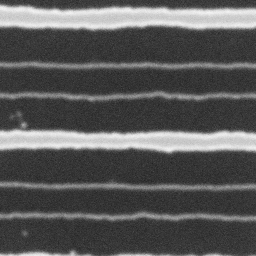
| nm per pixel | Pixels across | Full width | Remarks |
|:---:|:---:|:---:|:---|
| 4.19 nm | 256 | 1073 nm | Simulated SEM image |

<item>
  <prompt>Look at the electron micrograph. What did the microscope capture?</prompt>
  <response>lines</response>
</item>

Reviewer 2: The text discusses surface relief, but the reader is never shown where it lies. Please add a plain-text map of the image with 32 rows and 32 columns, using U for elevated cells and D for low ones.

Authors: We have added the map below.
DDDDDDDDDDDDDDDDDDDDDDDDDDDDDDDD
UUUUUUUUUUUUUUUUUUUUUUUUUUUUUUUU
UUUUUUUUUUUUUUUUUUUUUUUUUUUUUUUU
DDDDDDDDDDDUDDDDDDDDDDDDDDDDDDDD
DDDDDDDDDDDDDDDDDDDDDDDDDDDDDDDD
DDDDDDDDDDDDDDDDDDDDDDDDDDDDDDDD
DDDDDDDDDDDDDDDDDDDDDDDDDDDDDDDD
DDDDDDDDDDDDDDDDDDDDDDDDDDDDDDDD
UUUUUUUUUUUUUUUUUUUUUUUUUUUUUUUU
UUUUUUUUUUUUUUUUUUUUUUUUUUUUUUUU
UUUUUUUUUUUUUUUUUUUUUUUUUUUUUUUU
UUUUUUUUUUUUUUUUUUUUUUUUUUUUUUUU
DDDDDDDDDDDDDDDDDDDDDDDDDDDDDDDD
DDDDDDDDDDDDDDDDDDDDDDDDDDDDDDDD
DDDDDDDDDDDDDDDDDDDDDDDDDDDDDDDD
DDDDDDDDDDDDDDDDDDDDDDDDDDDDDDDD
UUUUUUUUDDDDDDDDDDDDDDDDDDDDDDDD
UUUUUUUUUUUUUUUUUUUUUUUUUUUUUUUU
UDDDDDDDDDDDDDDDDDUUUUUUUUUUUUUU
DDDDDDDDDDDDDDDDDDDDDDDDDDDDDDDD
DDDDDDDDDDDDDDDDDDDDDDDDDDDDDDDD
DDDDDDDDDDDDDDDDDDDDDDDDDDDDDDDD
DDDDDDDDDDDDDDDDDDDDDDDDDDDDDDDD
UUUUUUUUUUUUUUUUUUUUUUUUUUUUUUUU
UUUUUUUUUUUUUUUUUUUUUUUUUUUUUUUU
UUUUUUUUUUUUUUUUUUUUUUUUUUUUUUUU
UUUUUUUUUUUUUUUUUUUUUUUUUUUUUUUU
DDDDDDDDDDDDDDDDDDDDDDDDDDDDDDDD
DDDDDDDDDDDDDDDDDDDDDDDDDDDDDDDD
DDDDDDDDDDDDDDDDDDDDDDDDDDDDDDDD
DDDDDDDDDDDDDDDDDDDDDDDDDDDDDDDD
DDDDDDDDDDDDDDDDDDDDDDDDDDDDDDDD